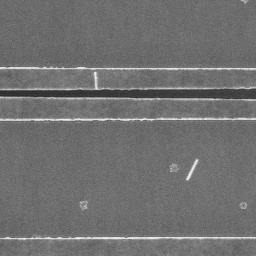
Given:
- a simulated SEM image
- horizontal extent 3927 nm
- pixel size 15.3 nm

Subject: lines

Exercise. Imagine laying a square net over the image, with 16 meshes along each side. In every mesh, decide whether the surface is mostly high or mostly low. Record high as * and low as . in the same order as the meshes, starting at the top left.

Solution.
................
................
................
................
****************
****************
****************
................
................
................
................
................
................
................
................
****************